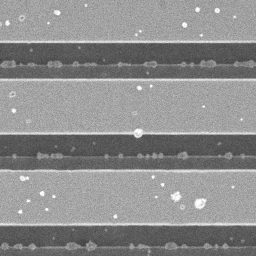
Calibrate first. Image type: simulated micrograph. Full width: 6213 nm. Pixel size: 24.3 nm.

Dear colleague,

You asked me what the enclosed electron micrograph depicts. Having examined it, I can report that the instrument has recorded lines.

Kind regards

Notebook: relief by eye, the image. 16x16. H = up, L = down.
HHHHHHHHHHHHHHHH
HHHHHHHHHHHHHHHH
HHHHHHHHHHHHHHHH
LLLLLLLLLLLLLLLL
LLLLLLLLLLLLLLLL
HHHHHHHHHHHHHHHH
HHHHHHHHHHHHHHHH
HHHHHHHHHHHHHHHH
LLLLLLLLLLLLLLLL
LLLLLLLLLLLLLLLL
LLLLLLLLLLLLLLLL
HHHHHHHHHHHHHHHH
HHHHHHHHHHHHHHHH
HHHHHHHHHHHHHHHH
LLLLLLLLLLLLLLLL
LLLLLLLLLLLLLLLL